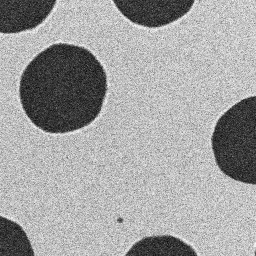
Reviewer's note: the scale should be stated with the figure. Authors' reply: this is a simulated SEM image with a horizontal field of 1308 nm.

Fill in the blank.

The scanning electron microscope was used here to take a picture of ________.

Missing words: holes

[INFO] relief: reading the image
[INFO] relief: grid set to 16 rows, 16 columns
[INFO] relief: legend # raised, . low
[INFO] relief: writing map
...####.....####
..#######.######
################
##....##########
#......#########
#......#########
#.....#########.
##....########..
#############...
#############...
##############..
################
################
################
..##############
..######....####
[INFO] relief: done